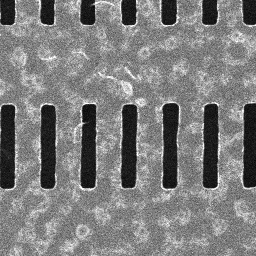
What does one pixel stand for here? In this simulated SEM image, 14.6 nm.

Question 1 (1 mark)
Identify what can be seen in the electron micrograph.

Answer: holes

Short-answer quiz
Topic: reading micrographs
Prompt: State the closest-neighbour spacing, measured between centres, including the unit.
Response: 591 nanometers